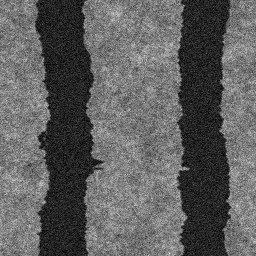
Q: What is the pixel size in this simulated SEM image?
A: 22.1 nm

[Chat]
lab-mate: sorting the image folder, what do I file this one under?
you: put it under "one or a few lines or trenches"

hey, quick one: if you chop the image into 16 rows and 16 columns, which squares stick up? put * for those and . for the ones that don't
**...******...**
**...******...**
**...******...**
***...*****...**
***...*****...**
***...*****...**
***...*****...**
***...*****...**
***...*****...**
***...*****...**
***...*****...**
***..******...**
***..******...**
**...*******..**
**...******...**
**...******...**